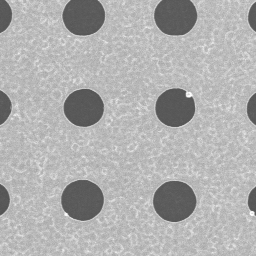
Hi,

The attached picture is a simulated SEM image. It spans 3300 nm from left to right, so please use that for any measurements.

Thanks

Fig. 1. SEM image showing holes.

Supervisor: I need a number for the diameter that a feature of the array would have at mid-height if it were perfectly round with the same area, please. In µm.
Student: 0.523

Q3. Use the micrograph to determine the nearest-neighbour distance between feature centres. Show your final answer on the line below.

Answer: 1180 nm